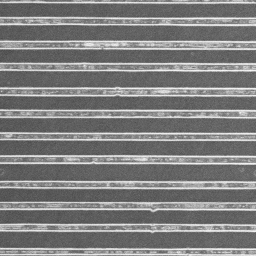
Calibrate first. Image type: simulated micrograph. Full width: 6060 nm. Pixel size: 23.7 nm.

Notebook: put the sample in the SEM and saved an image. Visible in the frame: parallel lines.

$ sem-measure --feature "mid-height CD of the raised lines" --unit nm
157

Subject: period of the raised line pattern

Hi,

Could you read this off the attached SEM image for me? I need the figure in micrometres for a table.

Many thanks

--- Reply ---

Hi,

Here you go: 0.546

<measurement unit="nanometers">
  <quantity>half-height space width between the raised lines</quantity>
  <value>385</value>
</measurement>